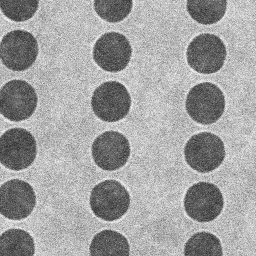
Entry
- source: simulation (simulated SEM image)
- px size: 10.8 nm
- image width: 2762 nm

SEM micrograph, a regular array of holes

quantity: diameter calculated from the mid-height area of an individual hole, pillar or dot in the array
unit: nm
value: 451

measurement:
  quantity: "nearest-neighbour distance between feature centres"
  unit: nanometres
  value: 532